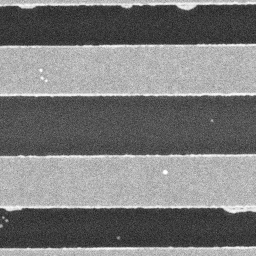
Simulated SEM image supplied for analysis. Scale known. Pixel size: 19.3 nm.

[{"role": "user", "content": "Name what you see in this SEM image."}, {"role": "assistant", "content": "lines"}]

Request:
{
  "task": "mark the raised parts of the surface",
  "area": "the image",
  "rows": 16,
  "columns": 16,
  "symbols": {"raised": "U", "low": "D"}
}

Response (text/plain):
DDDDDDDDDDDDDDDD
DDDDDDDDDDDDDDDD
DDDDDDDDDDDDDDDD
UUUUUUUUUUUUUUUU
UUUUUUUUUUUUUUUU
UUUUUUUUUUUUUUUU
DDDDDDDDDDDDDDDD
DDDDDDDDDDDDDDDD
DDDDDDDDDDDDDDDD
DDDDDDDDDDDDDDDD
UUUUUUUUUUUUUUUU
UUUUUUUUUUUUUUUU
UUUUUUUUUUUUUUUU
DDDDDDDDDDDDDDDD
DDDDDDDDDDDDDDDD
DDDDDDDDDDUUUUUU